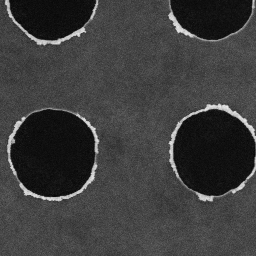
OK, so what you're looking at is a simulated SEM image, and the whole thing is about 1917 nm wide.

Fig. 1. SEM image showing holes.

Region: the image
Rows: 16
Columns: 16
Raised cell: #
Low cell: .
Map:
#.....#####.....
#....######....#
###.############
################
################
################
################
##...#######...#
#.....#####.....
#.....#####.....
#.....#####.....
#....#######...#
################
################
################
################